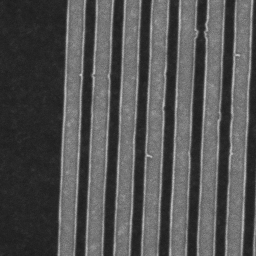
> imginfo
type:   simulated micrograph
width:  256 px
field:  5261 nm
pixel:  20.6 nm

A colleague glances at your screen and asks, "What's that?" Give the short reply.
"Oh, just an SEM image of parallel lines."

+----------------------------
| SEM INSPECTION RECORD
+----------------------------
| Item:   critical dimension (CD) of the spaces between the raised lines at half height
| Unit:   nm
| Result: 321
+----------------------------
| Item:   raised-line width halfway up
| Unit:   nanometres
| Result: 252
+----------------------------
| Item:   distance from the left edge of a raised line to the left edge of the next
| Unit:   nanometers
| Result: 573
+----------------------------